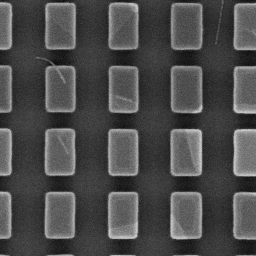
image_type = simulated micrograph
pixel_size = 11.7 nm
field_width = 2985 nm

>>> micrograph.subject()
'wiring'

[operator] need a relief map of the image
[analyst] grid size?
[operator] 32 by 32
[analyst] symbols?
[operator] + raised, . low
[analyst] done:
+.....+++.....+++.....+++......+
+.....+++.....+++....++++....+++
+.....+++.....+++....++++....+++
+.....+++.....+++....++++....+++
+.....+++.....+++....++++....+++
+.....+++.....+++....++++....+++
................................
................................
+.....+++.....+++.....+++.....++
+.....+++.....+++....++++....+++
+.....+++.....+++....++++....+++
+.....+++.....+++....++++....+++
+.....+++.....+++....++++....+++
+.....+++.....+++....++++....+++
................................
................................
+.....+++.....+++.....+++.....++
+.....+++.....+++....++++....+++
+.....+++.....+++....++++....+++
+.....+++.....+++....++++....+++
+.....+++.....+++....++++....+++
+.....+++.....+++....++++....+++
................................
................................
+.....+++.....+++....++++....+++
+.....+++.....+++....++++....+++
+.....+++.....+++....++++....+++
+.....+++.....+++....++++....+++
+.....+++.....+++....++++....+++
+.....+++.....+++.....+++....+++
................................
................................